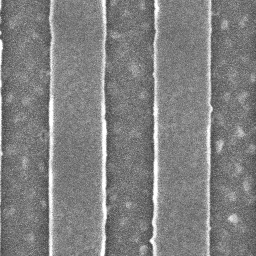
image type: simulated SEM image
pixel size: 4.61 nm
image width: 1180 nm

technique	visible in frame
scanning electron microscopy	one or a few lines or trenches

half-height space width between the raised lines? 226 nm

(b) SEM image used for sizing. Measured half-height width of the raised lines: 56 pixels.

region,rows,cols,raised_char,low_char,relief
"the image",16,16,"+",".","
...++++...+++...
...++++...+++...
...++++...+++...
...++++...+++...
...++++...+++...
...+++....+++...
...++++...+++...
...++++...+++...
...++++...+++...
...++++...+++...
...++++...+++...
...++++...+++...
...++++...+++...
...++++...+++...
...++++...+++...
...++++..++++...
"